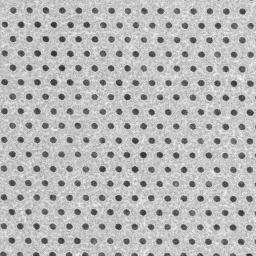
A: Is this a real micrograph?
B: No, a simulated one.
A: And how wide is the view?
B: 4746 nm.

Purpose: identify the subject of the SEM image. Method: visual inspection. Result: a regular array of holes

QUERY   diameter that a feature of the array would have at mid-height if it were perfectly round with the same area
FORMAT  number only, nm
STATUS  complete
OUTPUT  134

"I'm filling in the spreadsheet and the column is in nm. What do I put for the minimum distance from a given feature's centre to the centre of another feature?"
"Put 301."